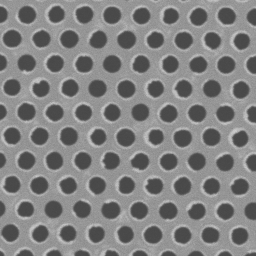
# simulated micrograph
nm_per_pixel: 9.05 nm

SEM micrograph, a regular array of holes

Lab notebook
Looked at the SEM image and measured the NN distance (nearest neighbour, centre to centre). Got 250 nm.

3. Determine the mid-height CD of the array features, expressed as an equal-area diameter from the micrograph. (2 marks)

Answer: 154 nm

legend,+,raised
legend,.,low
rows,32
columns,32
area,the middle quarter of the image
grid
+++....+++....+++....++++....++.
+++....+++....+++....++++...++++
++++++++++++++++++++++++++++++++
++++++++++++++++++++++++++++++++
...++++...++++...+++++..++++...+
....++.....++.....+++....+++....
....++.....++.....+++....+++....
...++++...++++...++++...++++....
+++++++++++++++.++++++++++++++++
++++++++++++++++++++++++++++++++
++++..+++++..+++++..++++++.+++++
+++....+++....+++....+++....+++.
+++....+++....+++....+++....+++.
+++....++++...+++....+++....+++.
++++++++++++++++++++++++++.+++++
++++++++++++++++++++++++++++++++
...+++++..++++...+++++..+++++.++
...++++...+++.....+++....+++....
...++++....++.....+++....++.....
...++++...+++....++++....+++....
+++++++++++++++.+++++++++++++..+
++++++++++++++++++++++++++++++++
+++...++++...+++++..+++++..+++++
+++....+++....+++....+++....+++.
+++....+++....+++....+++....+++.
+++...++++...++++....+++....+++.
++++.+++++++++++++++++++++++++++
++++++++++++++++++++++++++++++++
+.+++++..++++++..++++++++++++..+
...+++....++++...++++...++++....
...+++....++++....+++....++.....
...++++...++++...++++...++++....